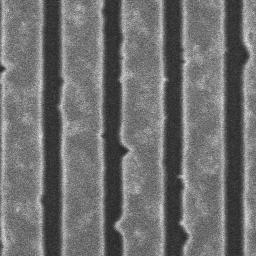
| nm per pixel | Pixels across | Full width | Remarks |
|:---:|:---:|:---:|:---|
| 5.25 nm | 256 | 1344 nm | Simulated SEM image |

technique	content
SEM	parallel lines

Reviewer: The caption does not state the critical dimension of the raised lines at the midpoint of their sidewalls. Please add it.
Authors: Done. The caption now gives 225 nanometers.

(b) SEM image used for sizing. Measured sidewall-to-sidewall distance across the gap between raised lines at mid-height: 96.5 nanometers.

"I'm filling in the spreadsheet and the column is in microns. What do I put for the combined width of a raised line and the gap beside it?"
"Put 0.318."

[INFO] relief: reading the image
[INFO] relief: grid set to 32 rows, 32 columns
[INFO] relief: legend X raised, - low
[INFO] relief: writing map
XXXXX---XXXXX--XXXXX---XXXXX--XX
XXXXX---XXXXX--XXXXX---XXXXX--XX
XXXXX---XXXXX--XXXXX---XXXXX--XX
XXXXX---XXXXX--XXXXXX--XXXXX--XX
XXXXX---XXXXX--XXXXX---XXXXX--XX
XXXXX---XXXXX--XXXXX---XXXXX--XX
XXXXX---XXXXX--XXXXX---XXXXX---X
XXXXX---XXXXX--XXXXXX--XXXXX---X
-XXXX---XXXXX--XXXXXX--XXXXX--XX
XXXXX---XXXXX--XXXXXX--XXXXX--XX
XXXXX---XXXXX--XXXXXX--XXXXX--XX
XXXXX---XXXXX--XXXXXX--XXXXX--XX
XXXXX---XXXXX--XXXXX---XXXXX--XX
XXXXX--XXXXXX--XXXXXX--XXXXX--XX
XXXXX---XXXXX--XXXXXX--XXXXX--XX
XXXXX---XXXXX--XXXXXX--XXXXX--XX
XXXXX---XXXXX--XXXXX---XXXXX---X
XXXXX---XXXXX--XXXXX---XXXXX---X
XXXXX---XXXXX---XXXX---XXXXX---X
XXXXX---XXXXX--XXXXX---XXXXX---X
XXXXX---XXXXX--XXXXX---XXXXX---X
XXXXX---XXXXX--XXXXX---XXXXX---X
XXXXX---XXXXX--XXXXX---XXXXX---X
XXXXX---XXXXX--XXXXX---XXXXX--XX
XXXXX---XXXXX--XXXXXX--XXXXX--XX
XXXXX---XXXXX--XXXXX---XXXXX--XX
XXXXX---XXXXX--XXXXX---XXXXX--XX
XXXXX---XXXXX--XXXXX---XXXXX--XX
XXXXX---XXXXX-XXXXXXX--XXXXX--XX
XXXXX---XXXXX--XXXXXX--XXXXX--XX
XXXXX---XXXXX--XXXXXX--XXXXX--XX
XXXXXX--XXXXX--XXXXX---XXXXX--XX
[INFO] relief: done